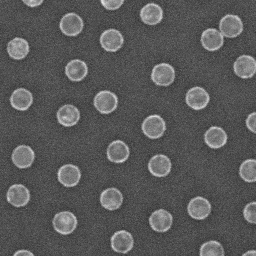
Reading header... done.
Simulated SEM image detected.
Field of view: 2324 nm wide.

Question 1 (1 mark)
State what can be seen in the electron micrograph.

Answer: a regular array of raised bodies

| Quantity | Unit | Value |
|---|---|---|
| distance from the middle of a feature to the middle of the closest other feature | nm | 384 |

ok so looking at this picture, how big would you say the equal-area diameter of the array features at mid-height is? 0.193 µm